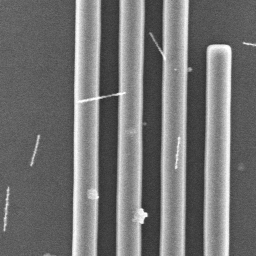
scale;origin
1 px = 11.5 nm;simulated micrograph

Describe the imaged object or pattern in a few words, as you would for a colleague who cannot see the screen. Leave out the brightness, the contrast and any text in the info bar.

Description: groups of lines, slits or small figures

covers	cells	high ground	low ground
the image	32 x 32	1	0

00000000001100011100011000000000
00000000001100011100011000000000
00000000001100011100011000000000
00000000001100011100011000000000
00000000001100011100011000000000
00000000001100011100011000000000
00000000001100011100111000111000
00000000001100011100111000111000
00000000001100011100011000111000
00000000001100011100011000111000
00000000001100011100111000111000
00000000001100011100111000111000
00000000001100011100111000111000
00000000001100011100111000111000
00000000001100011100111000111000
00000000011100011100111000111000
00000000011100011100111000111000
00000000011100011100111000111000
00000000011100011100111000111000
00000000011100011100111000111000
00000000011100011100111000111000
00000000011100011100111000111000
00000000011100011100111000111000
00000000011100011100111000111000
00000000011100011100111000111000
00000000011100011100111000110000
00000000011100011100111000110000
00000000011100011100111000110000
00000000011100011000111000110000
00000000011100011000111000110000
00000000011100011000111000110000
00000000011100011000111000110000